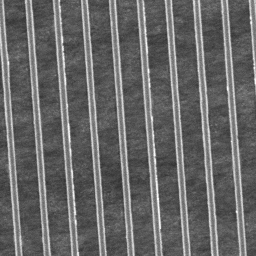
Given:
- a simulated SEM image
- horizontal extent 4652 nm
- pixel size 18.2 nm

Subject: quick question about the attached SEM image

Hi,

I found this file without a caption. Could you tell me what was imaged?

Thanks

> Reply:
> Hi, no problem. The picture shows parallel lines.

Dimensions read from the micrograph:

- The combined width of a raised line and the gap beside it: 508 nm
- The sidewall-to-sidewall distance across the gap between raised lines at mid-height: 408 nm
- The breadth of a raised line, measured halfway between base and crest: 104 nm